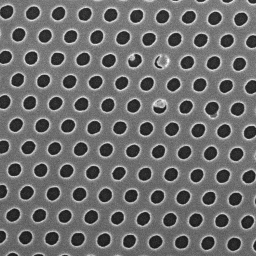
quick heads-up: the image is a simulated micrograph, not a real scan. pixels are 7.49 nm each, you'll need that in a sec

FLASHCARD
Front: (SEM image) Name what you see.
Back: a regular array of holes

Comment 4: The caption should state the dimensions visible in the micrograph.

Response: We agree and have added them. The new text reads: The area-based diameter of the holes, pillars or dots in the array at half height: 102 nm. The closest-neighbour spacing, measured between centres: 192 nanometers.